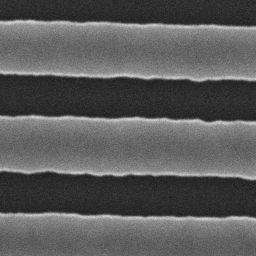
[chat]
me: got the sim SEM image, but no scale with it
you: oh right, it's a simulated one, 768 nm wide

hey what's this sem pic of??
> lines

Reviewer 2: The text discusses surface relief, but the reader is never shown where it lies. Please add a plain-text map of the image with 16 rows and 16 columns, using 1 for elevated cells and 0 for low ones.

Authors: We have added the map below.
0000000000000000
1111111100000000
1111111111111111
1111111111111111
1111111111111111
0000000000000000
0000000000000000
1111111111100000
1111111111111111
1111111111111111
1111111111111111
0000000000000000
0000000000000000
1111111000000000
1111111111111111
1111111111111111